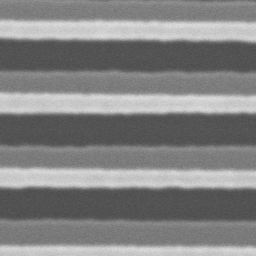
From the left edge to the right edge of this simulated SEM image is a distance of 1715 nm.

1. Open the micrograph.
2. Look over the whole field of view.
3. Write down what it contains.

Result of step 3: lines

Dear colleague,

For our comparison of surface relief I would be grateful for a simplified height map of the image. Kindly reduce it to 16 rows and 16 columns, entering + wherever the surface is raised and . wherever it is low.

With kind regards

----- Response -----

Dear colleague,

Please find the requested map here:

++++++++++++++++
++++++++++++++++
..........+.++++
................
................
++++++++++++++++
++++++++++++++++
................
................
++++++++++++++++
++++++++++++++++
++++++++++++++++
................
................
++++++++++++++++
++++++++++++++++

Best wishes